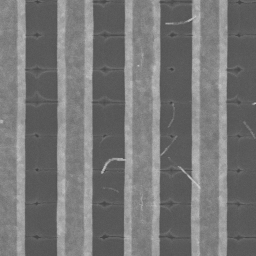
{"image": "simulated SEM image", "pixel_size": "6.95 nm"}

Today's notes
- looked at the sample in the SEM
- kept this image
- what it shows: wiring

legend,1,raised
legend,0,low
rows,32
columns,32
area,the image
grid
11100000111000001111000001110000
11100000111000001111000001110000
11100000111000001111000011110000
11100000111000001111000001110000
11100000111000001111000001110000
11100000111000001111000001110000
11100000111000001111000001110000
11100000111000001111000001110000
11100000111000001111000001110000
11100000111000001111000011110000
11100000111000001110000011110000
11100000111000001111000011110000
11100000111000001111000001110000
11100000111000001111000001110000
11100000111000001111000001110000
11100000111000001111000001110000
11100000111000001111000001110000
11100000111000001111000001110000
11100000111000001111000011110000
11100000111000001111000011110000
11100000111000001111000001110000
11100000111000001111000001110000
11100000111000001111000011110000
11100000111000001110000001110000
11100000111000001111000011110000
11100000111000001111000011110000
11100000111000001111000011110000
11100000111000001110000011110000
11100000111000001110000011110000
11100000111000001110000011110000
11100000111000001110000011110000
11100000111000001110000011110000